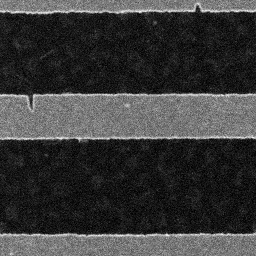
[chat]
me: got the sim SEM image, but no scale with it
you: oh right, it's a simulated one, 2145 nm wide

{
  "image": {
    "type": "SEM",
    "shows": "one or a few lines or trenches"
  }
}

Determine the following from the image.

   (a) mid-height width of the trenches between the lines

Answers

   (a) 701 nm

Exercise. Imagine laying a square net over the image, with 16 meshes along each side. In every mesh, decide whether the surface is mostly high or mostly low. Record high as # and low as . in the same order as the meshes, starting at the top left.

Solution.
################
................
................
................
................
................
################
################
################
................
................
................
................
................
................
################